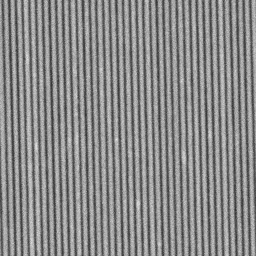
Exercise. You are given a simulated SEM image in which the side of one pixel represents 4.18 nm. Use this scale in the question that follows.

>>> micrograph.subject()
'parallel lines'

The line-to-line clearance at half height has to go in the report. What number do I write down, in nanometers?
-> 10.5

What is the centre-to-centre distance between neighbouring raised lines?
28 nm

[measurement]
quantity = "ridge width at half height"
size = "17.8 nm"